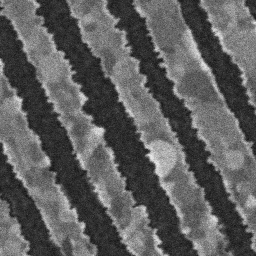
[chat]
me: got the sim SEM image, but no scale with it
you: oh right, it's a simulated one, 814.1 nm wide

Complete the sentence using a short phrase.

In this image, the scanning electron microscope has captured one or a few lines or trenches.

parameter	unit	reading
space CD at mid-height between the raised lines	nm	88.7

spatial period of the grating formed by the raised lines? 194 nanometers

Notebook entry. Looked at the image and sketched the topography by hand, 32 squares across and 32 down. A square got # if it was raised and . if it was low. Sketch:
#####....####....#####...#####..
####.....####....#####....#####.
.####.....####....#####...######
..###.....####....#####....#####
..####....######...#####...#####
...####....#####...#####....####
...####.....####....#####...####
....####.....####...#####....###
.....####....####....#####....##
.....####....#####...######...##
#....#####....####....#####....#
##....####.....####...#####....#
##....#####....####....#####...#
###....###......####....####....
###....####......###....#####...
###.....####.....####...######..
####....#####.....####...#####..
#####....####.....####...######.
.####....####......####...#####.
.#####....####.....####...######
.#####....####.....####....#####
..####.....####.....####...#####
...####....####.....####....####
...####.....####....#####...####
....####....####.....####....###
#.#..###.....####.....####....##
#....####.....####....####....##
##....####....#####....####...##
##....####.....####....####....#
###...#####....####....#####....
###....#####....####....####....
###.....####.....###.....###....